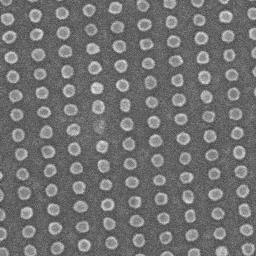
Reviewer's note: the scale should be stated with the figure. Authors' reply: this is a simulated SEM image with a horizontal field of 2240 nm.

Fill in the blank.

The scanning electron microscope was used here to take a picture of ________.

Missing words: a regular array of raised bodies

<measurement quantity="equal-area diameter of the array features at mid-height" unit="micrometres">0.102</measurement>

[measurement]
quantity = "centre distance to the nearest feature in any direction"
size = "168 nm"